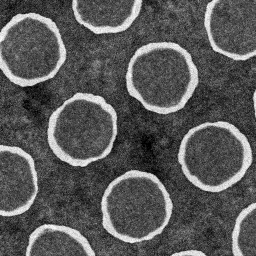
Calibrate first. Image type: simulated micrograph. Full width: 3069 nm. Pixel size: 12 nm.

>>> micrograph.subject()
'raised bodies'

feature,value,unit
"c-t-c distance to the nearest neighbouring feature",1120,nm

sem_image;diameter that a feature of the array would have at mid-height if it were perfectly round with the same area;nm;798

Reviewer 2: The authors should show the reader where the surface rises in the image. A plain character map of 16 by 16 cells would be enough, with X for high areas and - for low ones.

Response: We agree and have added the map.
-----XXXX----XXX
-XX--XXX-----XXX
XXXX---------XXX
XXXX----XXXX---X
XXX-----XXXX----
--------XXXX----
----XXX--XX-----
---XXXX---------
---XXXX-----XXX-
X---XXX----XXXXX
XX---------XXXX-
XX-----XXX--XX--
XX-----XXXX-----
-------XXX-----X
--XXX--XXX-----X
--XXX----------X